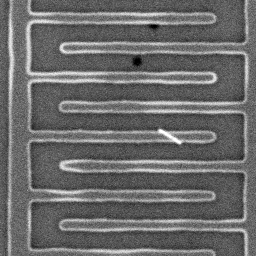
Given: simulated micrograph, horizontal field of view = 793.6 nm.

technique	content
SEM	groups of lines, slits or small figures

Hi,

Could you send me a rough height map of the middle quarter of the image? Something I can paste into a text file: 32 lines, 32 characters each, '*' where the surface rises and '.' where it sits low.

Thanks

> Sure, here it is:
................................
................................
***********************.********
********************************
...........*******......********
................................
................................
................................
................................
***........*******..............
********************************
********************************
................................
................................
................................
................................
................................
********************************
********************************
............................*...
................................
................................
................................
................................
.***************..******...***..
********************************
.*******************************
................................
................................
................................
................................
................................